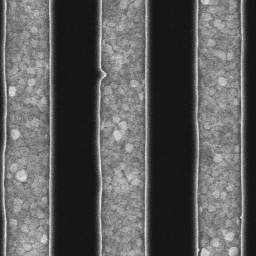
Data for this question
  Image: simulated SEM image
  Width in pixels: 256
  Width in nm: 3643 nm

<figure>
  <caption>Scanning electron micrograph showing one or a few lines or trenches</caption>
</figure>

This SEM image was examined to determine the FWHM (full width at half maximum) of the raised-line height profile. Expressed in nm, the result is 736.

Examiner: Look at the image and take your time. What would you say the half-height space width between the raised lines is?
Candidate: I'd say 0.628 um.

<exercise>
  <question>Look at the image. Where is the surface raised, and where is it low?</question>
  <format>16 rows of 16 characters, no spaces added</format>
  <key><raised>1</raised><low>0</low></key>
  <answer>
0001110001110001
0001110001110001
0001110001110001
0001110001110001
0001110001110001
0001110001110001
0001110001110001
0001110001110001
0001110001110001
0001110001110001
0001110001110001
0001110001110001
0001110001110001
0001110001110001
0001110001110001
0001110001110001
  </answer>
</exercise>